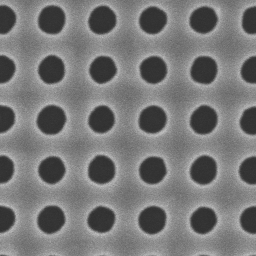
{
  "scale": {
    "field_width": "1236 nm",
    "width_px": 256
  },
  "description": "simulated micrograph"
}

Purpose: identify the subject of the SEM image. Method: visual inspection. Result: a regular array of holes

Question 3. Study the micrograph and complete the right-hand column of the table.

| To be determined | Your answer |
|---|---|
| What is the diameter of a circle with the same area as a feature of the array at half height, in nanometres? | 135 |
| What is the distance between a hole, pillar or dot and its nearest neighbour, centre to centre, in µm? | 0.241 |